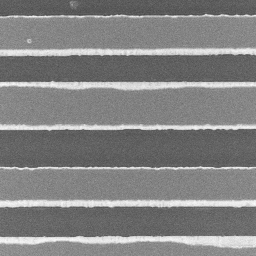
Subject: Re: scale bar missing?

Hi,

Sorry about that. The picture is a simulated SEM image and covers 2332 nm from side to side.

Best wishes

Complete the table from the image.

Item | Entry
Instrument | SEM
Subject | lines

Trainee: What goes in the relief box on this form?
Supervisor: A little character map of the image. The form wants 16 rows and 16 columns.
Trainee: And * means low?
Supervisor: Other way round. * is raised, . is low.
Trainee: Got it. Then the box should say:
................
****************
****************
................
................
****************
****************
****************
................
................
****************
****************
****************
................
................
****************